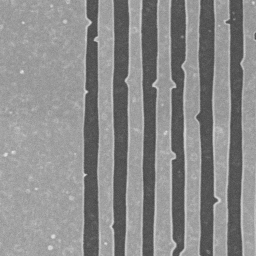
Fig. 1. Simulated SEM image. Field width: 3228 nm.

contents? parallel lines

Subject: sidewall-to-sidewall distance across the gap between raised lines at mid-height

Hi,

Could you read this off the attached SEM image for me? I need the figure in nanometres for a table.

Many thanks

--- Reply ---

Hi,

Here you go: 176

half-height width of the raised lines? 188 nm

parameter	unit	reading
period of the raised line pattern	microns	0.364